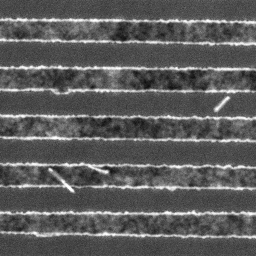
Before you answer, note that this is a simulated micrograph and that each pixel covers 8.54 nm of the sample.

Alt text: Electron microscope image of lines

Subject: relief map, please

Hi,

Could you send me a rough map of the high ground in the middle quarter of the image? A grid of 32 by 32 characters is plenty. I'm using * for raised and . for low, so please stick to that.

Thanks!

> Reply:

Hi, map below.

................................
********************************
********************************
********************************
********************************
********************************
********************************
................................
................................
................................
................................
................................
................................
********************************
********************************
********************************
********************************
********************************
********************************
................................
................................
................................
................................
................................
................................
***********************.**.*.***
********************************
********************************
********************************
********************************
********************************
................................